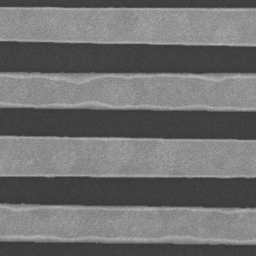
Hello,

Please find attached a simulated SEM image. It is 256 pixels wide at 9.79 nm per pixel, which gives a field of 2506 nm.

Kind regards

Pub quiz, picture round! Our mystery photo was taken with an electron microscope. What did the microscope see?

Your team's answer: lines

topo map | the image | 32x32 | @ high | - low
--------------------------------
@@@@@@@@@@@@@@@@@@@@@@@@@@@@@@@@
@@@@@@@@@@@@@@@@@@@@@@@@@@@@@@@@
@@@@@@@@@@@@@@@@@@@@@@@@@@@@@@@@
@@@@@@@@@@@@@@@@@@@@@@@@@@@@@@@@
------------------@@@@@@@@@@@@@@
--------------------------------
--------------------------------
--------------------------------
@@@@@@@@@--@@@@@@@@@@@@@@@-@@@@@
@@@@@@@@@@@@@@@@@@@@@@@@@@@@@@@@
@@@@@@@@@@@@@@@@@@@@@@@@@@@@@@@@
@@@@@@@@@@@@@@@@@@@@@@@@@@@@@@@@
-------------@@@@@@@@@@@@@@@@@@@
--------------------------------
--------------------------------
--------------------------------
@@@@@@@@@@@@@@@@@@@@@@@@@@@@@@--
@@@@@@@@@@@@@@@@@@@@@@@@@@@@@@@@
@@@@@@@@@@@@@@@@@@@@@@@@@@@@@@@@
@@@@@@@@@@@@@@@@@@@@@@@@@@@@@@@@
@@@@@@@@@@@@@@@@@@@@@@@@@@@@@@@@
--------------------------------
--------------------------------
--------------------------------
--------------------------------
@@@@@@@@@@@@@@@@@@@@@@@@@@@@@@@@
@@@@@@@@@@@@@@@@@@@@@@@@@@@@@@@@
@@@@@@@@@@@@@@@@@@@@@@@@@@@@@@@@
@@@@@@@@@@@@@@@@@@@@@@@@@@@@@@@@
--------------------------------
--------------------------------